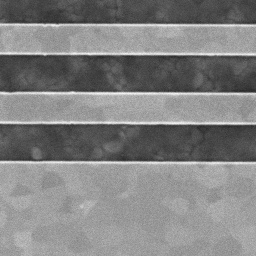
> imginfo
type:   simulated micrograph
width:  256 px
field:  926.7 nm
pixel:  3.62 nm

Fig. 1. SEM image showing one or a few lines or trenches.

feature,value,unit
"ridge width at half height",108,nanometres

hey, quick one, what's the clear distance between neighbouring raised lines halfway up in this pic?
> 39.1 px